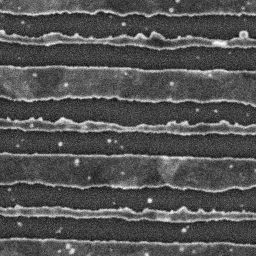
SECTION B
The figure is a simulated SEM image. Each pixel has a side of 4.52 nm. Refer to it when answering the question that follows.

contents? lines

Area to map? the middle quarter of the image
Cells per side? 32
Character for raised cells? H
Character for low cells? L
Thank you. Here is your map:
LLLLLLLLLLLLLLLLLLLLLLLLLLLLLLLL
HHHHHHHHHHHHHHHHHHHHLLLLLHHLHHHL
HHHHHHHHHHHHHHHHHHHHHHHHHHHHHHHH
HHHHHHHHHHHHHHHHHHHHHHHHHHHHHHHH
HHHHHHHHHHHHHHHHHHLHHHHHHHHHHHHH
HHHHHHHHHHHHHHHHHHHHHHHHHHLLHHHH
HLHHHHHHHHHHHHHHHHHHHHHHHHHHHHHH
HHHHHHHHHHHHHHHHHHHHHHHHHHHHHHHH
LLLLLLLLLLLLLLHHHHHHHHHHHHHHHHHH
LLLLLLLLLLLLLLLLLLLLLLHLLLLHHLLL
LLLLLLLLLLLLLLLLLLLLLLLLLLLLLLLL
LLLLLLLLLLLLLLLLLLLLLLLLLLLLLLLL
LLLLLLLLLLLLLLLLLLLLLLLLLLLLLLLL
LLLLLLLLLLLLLLLLLLLLLLLLLLLLLLLL
HLLLLHHLLLLLLLLLLLLLLLLLLLLLLLLL
HHHHHHHHHHHHHHLLLLHHHHHHHHHHHHHH
HHHHHHHHHHHHHHHHHHHHHHHHHHHHHHHH
LLLLLLLLLLLLLLLLLLLLLLLLLLLLLHHH
LLLLLLLLLLLLLLLLLLLLLLLLLLLLLLLL
LLLLLLLLLLLLLLLLLLLLLLLLLLLLLLLL
LLLLLLLLLLLLLLLLLLLLLLLLLLLLLLLL
LLLLLLLLLLLLLLLLLLLLLLLLLLLLLLLL
LLLLLLLLLLLLLLLLLLLLLLLLLLLLLLLL
HHHHHHHHHHHHHHHHHHHHHHHHHHHHHLHH
HHHHHHHHHHHHHHHHHHHHHHHHHLHHHLHH
HHHHHHHHHHHHHHHHHHHHHHHHHHHHHHHH
HHHHHHHHHHHHHHHHHHHHHHHHHHHLHHHH
HHHHHHHHHHHHHHHHHHHHHHHHHHHHHHHH
HLHHHHHHHHHHHHHHHHHHHHHHHHHHHHHH
HHHHHHHHHHHHHHHHHHHHHHHHHHHLHHHH
HHHHHHHHHHLHHHHHHHHHHHHHHLHHHHHH
LLLLLLLLLLLLLLLLLLLLLLLLLLLLLLLL